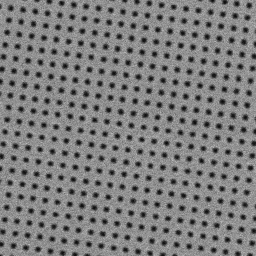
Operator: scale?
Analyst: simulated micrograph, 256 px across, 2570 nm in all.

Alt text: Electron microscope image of a regular array of holes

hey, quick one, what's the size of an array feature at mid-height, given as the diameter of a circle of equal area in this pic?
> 59.9 nanometers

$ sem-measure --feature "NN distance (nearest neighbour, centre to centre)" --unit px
12.2